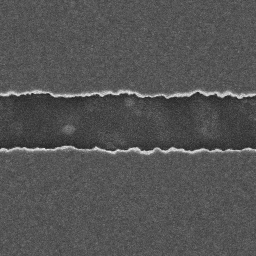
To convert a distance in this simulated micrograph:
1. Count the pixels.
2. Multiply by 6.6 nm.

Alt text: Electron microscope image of one or a few lines or trenches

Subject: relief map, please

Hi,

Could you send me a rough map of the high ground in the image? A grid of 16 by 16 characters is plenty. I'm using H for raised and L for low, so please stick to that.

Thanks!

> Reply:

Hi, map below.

HHHHHHHHHHHHHHHH
HHHHHHHHHHHHHHHH
HHHHHHHHHHHHHHHH
HHHHHHHHHHHHHHHH
HHHHHHHHHHHHHHHH
HHHHHHHHHHHHHHHH
LLLLLLLLLLLLLLLL
LLLLLLLLLLLLLLLL
LLLLLLLLLLLLLLLL
HHHHHHHHHHHHHHHH
HHHHHHHHHHHHHHHH
HHHHHHHHHHHHHHHH
HHHHHHHHHHHHHHHH
HHHHHHHHHHHHHHHH
HHHHHHHHHHHHHHHH
HHHHHHHHHHHHHHHH